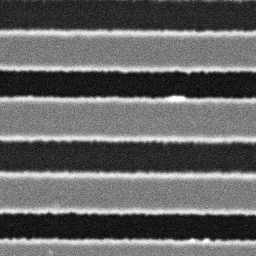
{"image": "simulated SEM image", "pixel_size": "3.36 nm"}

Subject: lines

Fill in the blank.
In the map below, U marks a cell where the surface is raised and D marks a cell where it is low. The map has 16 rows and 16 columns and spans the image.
DDDDDDDDDDDDDDDD
DDDDDDDDDDDDDDDD
UUUUUUUUUUUUUUUU
UUUUUUUUUUUUUUUU
DDDDDDDDDDDDDDDD
DDDDDDDDDDDDDDDD
UUUUUUUUUUUUUUUU
UUUUUUUUUUUUUUUU
UUUUUUUUUUUUUUUU
DDDDDDDDDDDDDDDD
DDDDDDDDDDDDDDDD
UUUUUUUUUUUUUUUU
UUUUUUUUUUUUUUUU
DDDDDDDDDDDDDDDD
DDDDDDDDDDDDDDDD
UUUUUUUUUUUUUUUU